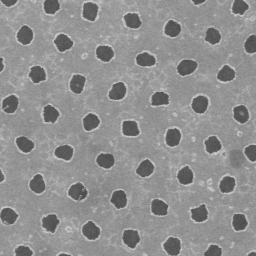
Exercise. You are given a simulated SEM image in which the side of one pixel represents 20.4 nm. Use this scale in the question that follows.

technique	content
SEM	a regular array of holes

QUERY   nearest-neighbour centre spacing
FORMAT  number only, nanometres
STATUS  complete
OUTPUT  822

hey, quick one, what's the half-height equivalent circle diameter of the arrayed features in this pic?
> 367 nm